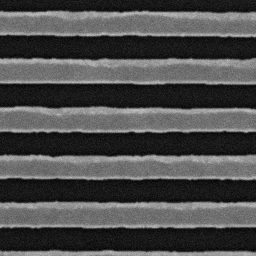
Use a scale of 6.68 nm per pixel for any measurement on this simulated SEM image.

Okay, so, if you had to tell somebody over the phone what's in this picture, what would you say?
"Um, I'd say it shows lines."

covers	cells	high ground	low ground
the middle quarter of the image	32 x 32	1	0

11111111111111111111111111111111
11111111111111111111111111111111
11111111111111111111111111111111
11111111111111111111111111111111
11111110111111111111111111111111
00000000000000000000000000000000
00000000000000000000000000000000
00000000000000000000000000000000
00000000000000000000000000000000
00000000000000000000000000000000
00000000000000000000000000000000
00001011111000000000000110000000
11111111111111111111111111111111
11111111111111111111111111111111
11111111111111111111111111111111
11111111111111111111111111111111
11111111111111111111111111111111
00000000000000000000000000000000
00000000000000000000000000000000
00000000000000000000000000000000
00000000000000000000000000000000
00000000000000000000000000000000
00000000000000000000000000000000
00000000000000000000111000000000
11111111111111111111111111111111
11111111111111111111111111111111
11111111111111111111111111111111
11111111111111111111111111111111
11111111111111111111111001111111
00000000000000000000000000000000
00000000000000000000000000000000
00000000000000000000000000000000